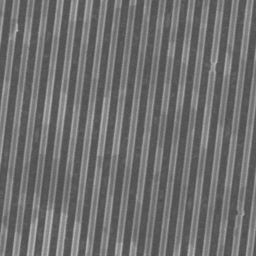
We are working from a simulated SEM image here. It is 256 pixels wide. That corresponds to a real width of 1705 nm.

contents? parallel lines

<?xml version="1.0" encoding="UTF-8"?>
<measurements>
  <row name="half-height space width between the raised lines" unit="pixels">8.93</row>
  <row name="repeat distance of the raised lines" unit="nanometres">96.5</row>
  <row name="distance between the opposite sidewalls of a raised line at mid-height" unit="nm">35.5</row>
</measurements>